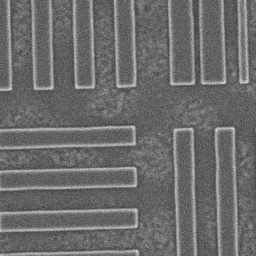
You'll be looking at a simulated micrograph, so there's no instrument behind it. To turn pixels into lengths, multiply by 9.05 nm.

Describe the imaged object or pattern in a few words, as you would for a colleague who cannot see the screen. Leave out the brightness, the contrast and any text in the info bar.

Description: groups of lines, slits or small figures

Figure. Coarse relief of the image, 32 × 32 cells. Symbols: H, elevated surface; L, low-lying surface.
HLLLHHLLLHHLLLHHHLLLLHHHLHHHLLHL
HLLLHHLLLHHHLLHHHLLLLHHHLHHHLLHL
HLLLHHLLLHHHLLHHHLLLLHHHLHHHLLHL
HLLLHHLLLHHHLLHHHLLLLHHHLHHHLLHL
HLLLHHLLLHHHLLHHHLLLLHHHLHHHLLHL
HLLLHHLLLHHHLLHHHLLLLHHHLHHHLLHL
HLLLHHLLLHHHLLHHHLLLLHHHLHHHLLHL
HLLLHHLLLHHHLLHHHLLLLHHHLHHHLLHL
HLLLHHLLLHHHLLHHHLLLLHHHLHHHLLHL
HLLLHHHLLHHHLLLHHLLLLHHHLHHHLLHL
HLLLHHHLLHHHLLLHHLLLLLHHLLLLLLLL
LLLLLLLLLLLLLLLLLLLLLLLLLLLLLLLL
LLLLLLLLLLLLLLLLLLLLLLLLLLLLLLLL
LLLLLLLLLLLLLLLLLLLLLLLLLLLLLLLL
LLLLLLLLLLLLLLLLLLLLLLLLLLLLLLLL
LLLLLLLLLLLLLLLLLLLLLLLLLLLLLLLL
HHHHHHHHHHHHHHHHHLLLLLHHLLLHHLLL
HHHHHHHHHHHHHHHHHLLLLLHHLLLHHLLL
HHHLLLLLLLLLLLLLLLLLLLHHLLLHHLLL
LLLLLLLLLLLLLLLLLLLLLLHHLLLHHLLL
LLLLLLLLLLLLLLLLLLLLLLHHLLLHHLLL
HHHHHHHHHHHHHHHHHLLLLLHHLLLHHLLL
HHHHHHHHHHHHHHHHHLLLLLHHLLLHHHLL
HHHHHHLLLLLLLLLLLLLLLLHHLLLHHHLL
LLLLLLLLLLLLLLLLLLLLLLHHLLLHHHLL
LLLLLLLLLLLLLLLLLLLLLLHHLLLHHHLL
LLLHHHHHHHHHHHHHHLLLLLHHLLLHHHLL
HHHHHHHHHHHHHHHHHLLLLLHHLLLHHHLL
HHHHHHHHHHHHHHHHLLLLLLHHLLLHHHLL
LLLLLLLLLLLLLLLLLLLLLLHHLLLHHHLL
LLLLLLLLLLLLLLLLLLLLLLHHLLLHHHLL
LLLLLLLLLLLLHHHHHLLLLLHHLLLHHHLL